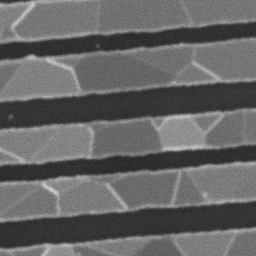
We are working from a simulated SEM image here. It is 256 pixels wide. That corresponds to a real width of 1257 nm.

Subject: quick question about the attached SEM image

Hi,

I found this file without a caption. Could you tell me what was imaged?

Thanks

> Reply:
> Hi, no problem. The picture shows lines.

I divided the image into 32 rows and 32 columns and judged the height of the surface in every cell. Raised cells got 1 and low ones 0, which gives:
00111111111111111111111111111111
11111111111111111111111111111111
11111111111111111111111111111111
11111111111111111111110000000000
11111111110000000000000000000000
00000000000000000000000001111111
00000000000011111111111111111111
00111111111111111111111111111111
11111111111111111111111111111111
11111111111111111111111111111111
11111111111111111111111110000000
11111111111111000000000000000000
11000000000000000000000000000000
00000000000000000000000000000000
00000000000000000000001111111111
00000000000111111111111111111111
11111111111111111111111111111111
11111111111111111111111111111111
11111111111111111111111111110000
11111111111111000000000000000000
10000000000000000000000000000111
00000000000000000111111111111111
00000011111111111111111111111111
11111111111111111111111111111111
11111111111111111111111111111111
11111111111111111111111111000000
11111111111111000000000000000000
11000000000000000000000000000000
00000000000000000000000000000000
00000000000000000000111111111111
00000000001111111111111111111111
11111111111111111111111111111111